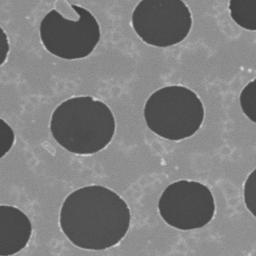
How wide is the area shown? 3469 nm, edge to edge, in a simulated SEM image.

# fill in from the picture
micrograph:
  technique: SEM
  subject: holes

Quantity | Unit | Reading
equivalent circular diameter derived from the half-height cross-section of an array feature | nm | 769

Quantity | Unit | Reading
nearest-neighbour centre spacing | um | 1.25